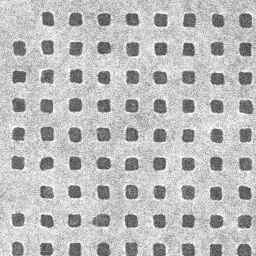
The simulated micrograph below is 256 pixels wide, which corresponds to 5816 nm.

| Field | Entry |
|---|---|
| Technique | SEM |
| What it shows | a regular array of holes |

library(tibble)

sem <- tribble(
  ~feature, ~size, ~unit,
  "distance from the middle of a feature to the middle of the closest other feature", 0.635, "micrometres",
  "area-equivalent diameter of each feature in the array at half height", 336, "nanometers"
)